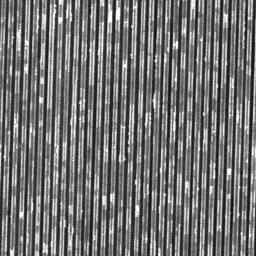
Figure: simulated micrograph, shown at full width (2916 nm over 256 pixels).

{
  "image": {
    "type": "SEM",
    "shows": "parallel lines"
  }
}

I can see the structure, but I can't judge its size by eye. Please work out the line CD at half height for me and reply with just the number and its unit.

0.0527 µm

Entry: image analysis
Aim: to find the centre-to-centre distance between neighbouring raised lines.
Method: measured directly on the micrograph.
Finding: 0.0938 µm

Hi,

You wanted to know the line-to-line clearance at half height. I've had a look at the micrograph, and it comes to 42.7 nm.